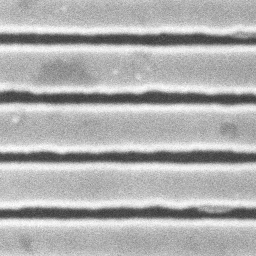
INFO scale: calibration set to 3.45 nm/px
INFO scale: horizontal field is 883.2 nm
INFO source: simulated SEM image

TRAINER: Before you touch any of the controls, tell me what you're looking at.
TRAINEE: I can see lines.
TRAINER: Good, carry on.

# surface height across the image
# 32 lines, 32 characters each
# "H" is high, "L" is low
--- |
HHHHHHHHHHHHHHHHHHHHHHHHHHHHHHHH
HHHHHHHHHHHHHHHHHHHHHHHHHHHHHHHH
HHHHHHHHHHHHHHHHHHHHHHHHHHHHHHHH
HHHHHHHHHHHHHHHHHHHHHHHHHHHHHHHH
LLLLLLLLLLLLLLLLLLLLLLLLLLLLLLLL
LLLLLLLLLLLLLLLLLLLLLLLLLLLLLLLL
HHHHHHHHHHHHHHHHHHHHHHHHHHHHHHHH
HHHHHHHHHHHHHHHHHHHHHHHHHHHHHHHH
HHHHHHHHHHHHHHHHHHHHHHHHHHHHHHHH
HHHHHHHHHHHHHHHHHHHHHHHHHHHHHHHH
HHHHHHHHHHHHHHHHHHHHHHHHHHHHHHHH
LLLLLLLLLLLLLLLLLLLLLLLLLLHLLHLH
LLLLLLLLLLLLLLLLLLLLLLLLLLLLLLLL
HHHHHHHHHHHHHHHHHHHHHHHHHHHHHHHH
HHHHHHHHHHHHHHHHHHHHHHHHHHHHHHHH
HHHHHHHHHHHHHHHHHHHHHHHHHHHHHHHH
HHHHHHHHHHHHHHHHHHHHHHHHHHHHHHHH
HHHHHHHHHHHHHHHHHHHHHHHHHHHHHHHH
HHHHHHHHHHHHHHHHHHHHHHHHLHLHHHHH
LLLLLLLLLLLLLLLLLLLLLLLLLLLLLLLL
LLLLLLLLLLLLLLLLLLLLLLLLLLLLLLLL
HHHHHHHHHHHHHHHHHHHHHHHHHHHHHHHH
HHHHHHHHHHHHHHHHHHHHHHHHHHHHHHHH
HHHHHHHHHHHHHHHHHHHHHHHHHHHHHHHH
HHHHHHHHHHHHHHHHHHHHHHHHHHHHHHHH
HHHHHHHHHHHHHHHHHHHHHHHHHHHHHHHH
LLLLLLLLLLLLLLLLLLLLLLLLLLLLLLLL
LLLLLLLLLLLLLLLLLLLLLLLLLLLLLLLL
HHHHHHHHHHHHHHHHHHHHHHHHHHHHHHHH
HHHHHHHHHHHHHHHHHHHHHHHHHHHHHHHH
HHHHHHHHHHHHHHHHHHHHHHHHHHHHHHHH
HHHHHHHHHHHHHHHHHHHHHHHHHHHHHHHH